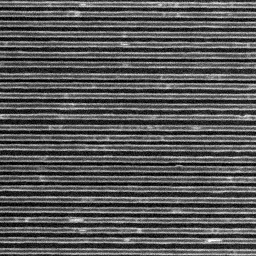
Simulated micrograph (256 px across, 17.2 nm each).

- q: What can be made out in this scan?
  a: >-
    parallel lines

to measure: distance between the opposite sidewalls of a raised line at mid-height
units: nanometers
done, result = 96.8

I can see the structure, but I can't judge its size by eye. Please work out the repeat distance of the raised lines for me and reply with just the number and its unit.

177 nm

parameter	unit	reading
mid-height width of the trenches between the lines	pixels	4.75